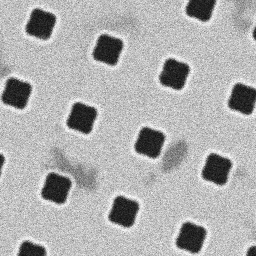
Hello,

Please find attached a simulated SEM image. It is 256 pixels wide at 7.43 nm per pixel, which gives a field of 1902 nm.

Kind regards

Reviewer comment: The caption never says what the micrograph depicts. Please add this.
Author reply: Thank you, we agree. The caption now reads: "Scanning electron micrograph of a regular array of holes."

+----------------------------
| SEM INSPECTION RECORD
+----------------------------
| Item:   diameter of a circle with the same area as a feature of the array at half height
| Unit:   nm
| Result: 225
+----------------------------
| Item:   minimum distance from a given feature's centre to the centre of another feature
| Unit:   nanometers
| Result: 534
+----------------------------